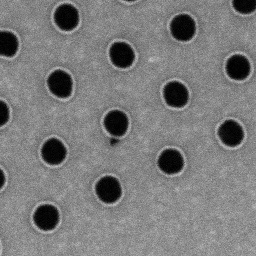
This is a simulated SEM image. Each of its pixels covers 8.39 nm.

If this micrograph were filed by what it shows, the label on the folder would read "a regular array of raised bodies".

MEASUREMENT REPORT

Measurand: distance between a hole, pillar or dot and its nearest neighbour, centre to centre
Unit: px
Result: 66.5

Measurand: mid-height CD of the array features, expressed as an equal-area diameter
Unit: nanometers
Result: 255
